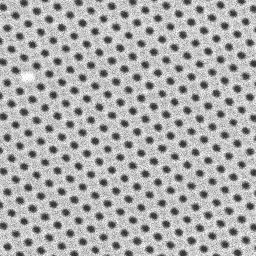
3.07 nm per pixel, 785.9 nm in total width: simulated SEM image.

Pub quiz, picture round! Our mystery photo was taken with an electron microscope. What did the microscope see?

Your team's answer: a regular array of holes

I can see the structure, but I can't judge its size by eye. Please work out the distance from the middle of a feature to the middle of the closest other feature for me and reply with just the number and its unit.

45.8 nanometers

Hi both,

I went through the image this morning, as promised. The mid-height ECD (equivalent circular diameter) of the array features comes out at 0.025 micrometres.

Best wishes